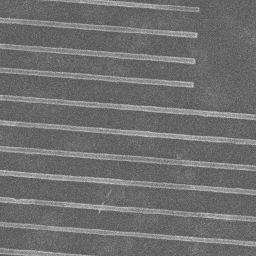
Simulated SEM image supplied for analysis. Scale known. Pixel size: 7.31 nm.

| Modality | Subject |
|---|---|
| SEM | parallel lines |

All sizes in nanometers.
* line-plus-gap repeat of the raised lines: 186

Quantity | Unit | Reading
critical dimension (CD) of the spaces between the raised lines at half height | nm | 152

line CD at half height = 0.0337 microns